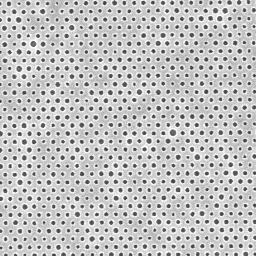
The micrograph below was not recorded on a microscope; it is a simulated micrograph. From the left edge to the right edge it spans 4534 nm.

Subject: a regular array of holes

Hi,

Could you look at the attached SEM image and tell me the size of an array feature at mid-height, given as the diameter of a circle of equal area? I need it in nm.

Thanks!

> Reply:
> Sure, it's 80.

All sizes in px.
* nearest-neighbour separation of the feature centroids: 9.05